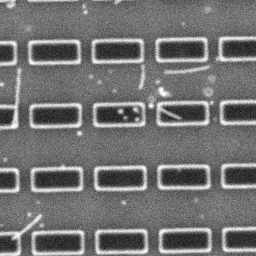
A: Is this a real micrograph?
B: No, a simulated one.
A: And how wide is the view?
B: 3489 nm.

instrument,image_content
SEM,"an array of small figures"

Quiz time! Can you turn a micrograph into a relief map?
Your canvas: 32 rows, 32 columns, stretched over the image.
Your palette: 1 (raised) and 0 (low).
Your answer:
00000000000000000000000000000000
00000000000000000000000000000000
00000000000000000000000000000000
00000000000000000000000000000000
00000000000000000000000000000000
11001111110011111100111111001111
11001111110011111100111111001111
11001111110011111100111110000000
00000000000000000000000000000000
00000000000000000000000000000000
00000000000000000000000000000000
00000000000000000000000000000000
00000000000000000000000000000000
11001111110011111100111111001111
11001111110011111100111111001111
11001111110011111100111110000000
00000000000000000000000000000000
00000000000000000000000000000000
00000000000000000000000000000000
00000000000000000000000000000000
00000000000000000000000000000000
11001111110011111100111111001111
11001111110011111100111111001111
11001111110011111100110000000000
00000000000000000000000000000000
00000000000000000000000000000000
00000000000000000000000000000000
00000000000000000000000000000000
00000000000000000000000000000000
11001111110011111100111111001111
11001111110011111100111111001111
11001111110011111100000000000000